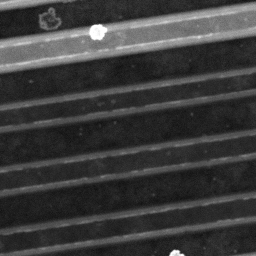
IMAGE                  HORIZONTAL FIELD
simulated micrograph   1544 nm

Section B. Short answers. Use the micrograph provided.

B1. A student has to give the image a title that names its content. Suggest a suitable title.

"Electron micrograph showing parallel lines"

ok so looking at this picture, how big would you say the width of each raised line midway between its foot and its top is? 147 nanometers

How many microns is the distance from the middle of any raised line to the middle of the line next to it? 0.374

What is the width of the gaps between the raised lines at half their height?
0.229 µm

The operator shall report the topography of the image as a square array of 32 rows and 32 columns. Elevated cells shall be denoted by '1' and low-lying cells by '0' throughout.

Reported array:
11000000000000000000000000000000
00000000000000000000000000011111
00000000000000000000011111111111
00000000000010111111111111111111
00000000111111111111111111100000
11111111111111111111000000000000
11111111111111000000000000000000
11111110000000000000000000000000
00000000000000000000000000000000
00000000000000000000000000111111
00000000000000000000111111111111
00000000000001111111111111111111
00000011111111111111111111000000
11111111111111111110000000000000
11111111111100000000000000000000
11111000000000000000000000000000
00000000000000000000000000000000
00000000000000000000000001111111
00000000000000000011111111111111
00000000000111111111111111111111
00000111111111111111111110000000
11111111111111111110000000000000
11111111111100000000000000000000
11111000000000000000000000000000
00000000000000000000000000000001
00000000000000000000000011111111
00000000000000000111111111111111
00000000000111111111111111111110
00001111111111111111111110000000
11111111111111111100000000000000
11111111111000000000000000000000
11110000000000000000000000000000